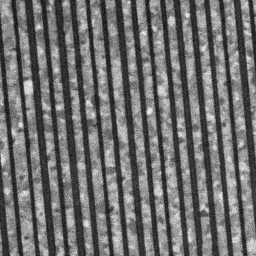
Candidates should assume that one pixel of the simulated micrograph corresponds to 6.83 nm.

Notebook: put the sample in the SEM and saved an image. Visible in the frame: parallel lines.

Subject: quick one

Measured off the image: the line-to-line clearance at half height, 41.6 nanometres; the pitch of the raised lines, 101 nanometers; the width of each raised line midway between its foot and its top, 58.6 nanometres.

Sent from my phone